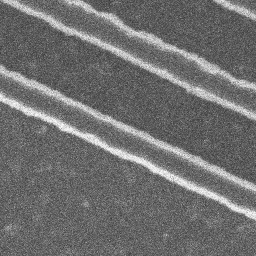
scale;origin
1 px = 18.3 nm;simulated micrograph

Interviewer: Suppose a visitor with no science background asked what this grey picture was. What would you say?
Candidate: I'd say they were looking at one or a few lines or trenches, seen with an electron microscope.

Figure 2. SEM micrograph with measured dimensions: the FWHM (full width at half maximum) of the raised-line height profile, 516 nanometres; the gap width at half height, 1.14 microns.